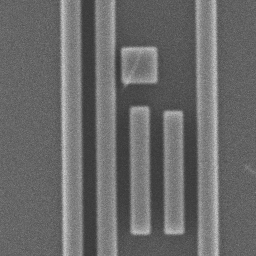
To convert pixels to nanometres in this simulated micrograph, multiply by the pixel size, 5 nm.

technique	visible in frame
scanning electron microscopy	groups of lines, slits or small figures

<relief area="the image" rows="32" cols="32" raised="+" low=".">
........++..++...........++.....
........++..++...........++.....
........++..++...........++.....
........++..++...........++.....
........++..++...........++.....
........++..++...........++.....
........++..++.+++++.....++.....
........++..++.+++++.....++.....
........++..++.+++++.....++.....
........++..++.+++++.....++.....
........++..++...........++.....
........++..++...........++.....
........++..++...........++.....
........++..++...+.......++.....
........++..++..+++..++..++.....
........++..++..+++..++..++.....
........++..++..+++..++..++.....
........++..++..+++..++..++.....
........++..++..+++..++..++.....
........++..++..+++..++..++.....
........++..++..+++..++..++.....
........++..++..+++..++..++.....
........++..++..+++..++..++.....
........++..++..+++..++..++.....
........++..++..+++..++..++.....
........++..++..+++..++..++.....
........++..++..+++..++..++.....
........++..++..+++..++..++.....
........++..++..+++..++..++.....
........++..++...........++.....
........++..++...........++.....
........++..++...........++.....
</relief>